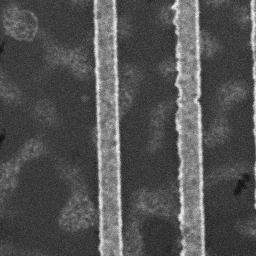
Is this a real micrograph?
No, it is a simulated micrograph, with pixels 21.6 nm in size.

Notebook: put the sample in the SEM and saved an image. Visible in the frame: one or a few lines or trenches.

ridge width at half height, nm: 416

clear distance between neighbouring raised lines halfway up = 1300 nm